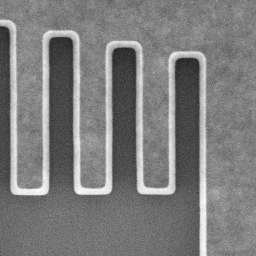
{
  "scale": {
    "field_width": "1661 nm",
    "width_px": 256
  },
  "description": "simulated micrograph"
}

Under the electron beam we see groups of lines, slits or small figures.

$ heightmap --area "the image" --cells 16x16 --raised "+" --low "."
++++++++++++++++
++++++++++++++++
.++..+++++++++++
.++..++..++.++++
.++..++..++..+++
.++..++..++..+++
.++..++..++..+++
.++..++..++..+++
.++..++..++..+++
.++..++..++..+++
.++..++..++..+++
.++..++..++..+++
.............+++
.............+++
.............+++
.............+++